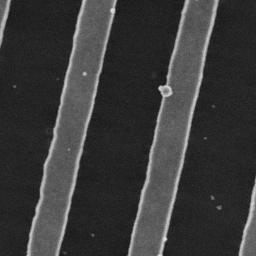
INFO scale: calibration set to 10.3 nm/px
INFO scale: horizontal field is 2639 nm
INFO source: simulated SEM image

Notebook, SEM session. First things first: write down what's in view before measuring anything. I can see lines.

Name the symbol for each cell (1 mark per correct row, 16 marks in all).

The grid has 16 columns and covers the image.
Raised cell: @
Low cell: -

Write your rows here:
@----@@----@@@--
-----@@----@@---
-----@@----@@---
----@@@----@@---
----@@-----@@---
----@@----@@----
----@@----@@----
----@@----@@----
---@@-----@@----
---@@----@@@----
---@@----@@-----
---@@----@@-----
--@@-----@@-----
--@@-----@@-----
--@@----@@-----@
--@@----@@-----@